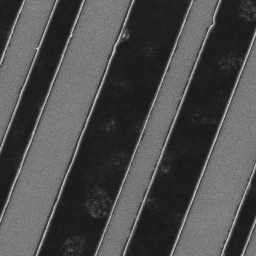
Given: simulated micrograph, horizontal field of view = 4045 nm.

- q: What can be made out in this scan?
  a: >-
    one or a few lines or trenches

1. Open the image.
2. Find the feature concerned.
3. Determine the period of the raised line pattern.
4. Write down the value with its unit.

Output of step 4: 1260 nanometers